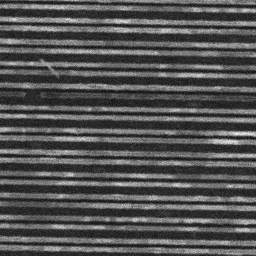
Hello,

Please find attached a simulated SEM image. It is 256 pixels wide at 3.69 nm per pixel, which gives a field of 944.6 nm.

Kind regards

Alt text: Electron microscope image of parallel lines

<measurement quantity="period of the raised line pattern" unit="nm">40.5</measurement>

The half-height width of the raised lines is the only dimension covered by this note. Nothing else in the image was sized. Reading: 4.25 px